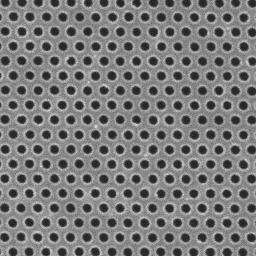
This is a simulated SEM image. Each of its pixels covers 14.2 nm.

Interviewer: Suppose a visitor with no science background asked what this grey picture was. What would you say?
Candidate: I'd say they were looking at a regular array of holes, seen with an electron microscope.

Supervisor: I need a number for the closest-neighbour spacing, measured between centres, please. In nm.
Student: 231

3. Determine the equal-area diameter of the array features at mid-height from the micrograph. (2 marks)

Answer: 130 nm